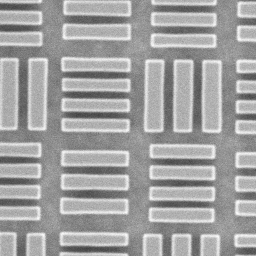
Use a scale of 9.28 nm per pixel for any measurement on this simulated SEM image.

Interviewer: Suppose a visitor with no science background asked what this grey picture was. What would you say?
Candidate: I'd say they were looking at groups of lines, slits or small figures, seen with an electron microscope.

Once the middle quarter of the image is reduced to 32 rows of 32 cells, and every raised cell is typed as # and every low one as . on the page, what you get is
################.....####...####
###.......######.....####...####
.....................####...####
.....................####...####
################.....####...####
################.....####...####
################.....####...####
.....................###....####
.....................####...####
################.....####...####
################.....####...####
################.....####...####
....................#####...####
....................#####...####
################....#####...####
################....#####...####
################.....###....####
................................
................................
................................
......................##########
......................##########
################......##########
################................
################................
................................
......................##########
......................##########
################......##########
################................
################................
......................##########